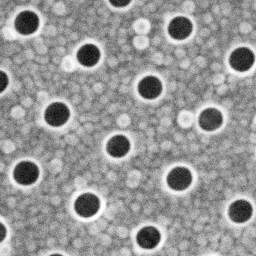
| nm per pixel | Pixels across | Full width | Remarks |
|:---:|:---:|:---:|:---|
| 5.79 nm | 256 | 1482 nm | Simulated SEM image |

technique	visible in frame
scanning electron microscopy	a regular array of holes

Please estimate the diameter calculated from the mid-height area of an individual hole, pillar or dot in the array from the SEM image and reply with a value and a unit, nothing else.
0.15 micrometres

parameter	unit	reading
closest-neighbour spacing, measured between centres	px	66.5